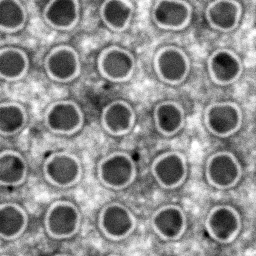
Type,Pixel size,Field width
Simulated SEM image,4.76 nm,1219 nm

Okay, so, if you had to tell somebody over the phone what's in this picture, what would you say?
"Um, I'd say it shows a regular array of raised bodies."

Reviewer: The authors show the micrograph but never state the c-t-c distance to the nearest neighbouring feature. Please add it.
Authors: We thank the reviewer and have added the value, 0.247 microns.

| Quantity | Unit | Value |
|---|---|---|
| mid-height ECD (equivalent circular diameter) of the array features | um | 0.161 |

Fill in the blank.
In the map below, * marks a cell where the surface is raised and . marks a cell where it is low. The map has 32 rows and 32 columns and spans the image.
**....****...***....***....***..
***...****...***...*****..****..
***...****...***...*****..****..
**.....**.....*......**....**...
................................
................................
***....**....***....***....**...
***...****..*****...***...****..
***...****...****...***...****..
***...***....***....***....***..
................................
................................
................................
***...****...***....***...****..
***...****...****..****...****..
***...****...****...***...****..
**......*.....**....**.....**...
................................
................................
**.....**.....**....***....**...
***...****...****..****...****..
***...****..*****..****...****..
***...****...***....***...****..
..............*.................
................................
.......**.....*.................
***...****...***....***...***...
***...****...****..****...****..
***...****...****..****...****..
**.....**.....**....**.....**...
................................
................................